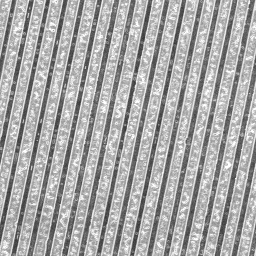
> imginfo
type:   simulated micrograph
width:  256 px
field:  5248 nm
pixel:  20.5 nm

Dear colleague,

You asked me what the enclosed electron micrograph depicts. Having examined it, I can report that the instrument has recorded parallel lines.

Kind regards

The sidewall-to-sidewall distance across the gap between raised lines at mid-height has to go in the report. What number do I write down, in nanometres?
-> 118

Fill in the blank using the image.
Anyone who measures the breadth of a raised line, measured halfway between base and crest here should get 236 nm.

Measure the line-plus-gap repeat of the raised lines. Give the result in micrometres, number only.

0.342